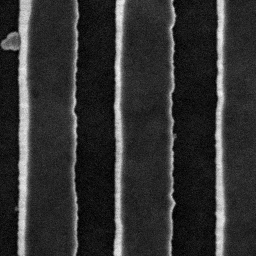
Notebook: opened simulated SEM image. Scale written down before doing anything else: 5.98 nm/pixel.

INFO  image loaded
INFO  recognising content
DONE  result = lines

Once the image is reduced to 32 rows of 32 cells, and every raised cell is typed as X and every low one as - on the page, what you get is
---XXXXXXX-----XXXXXXX------XXXX
---XXXXXXX-----XXXXXXX------XXXX
---XXXXXXX-----XXXXXXX------XXXX
---XXXXXXX-----XXXXXXX-----XXXXX
---XXXXXXX-----XXXXXX------XXXXX
---XXXXXXX-----XXXXXXX-----XXXXX
---XXXXXXX-----XXXXXXX-----XXXXX
---XXXXXXX-----XXXXXXX-----XXXXX
---XXXXXXX-----XXXXXXX-----XXXXX
---XXXXXX------XXXXXXX-----XXXXX
---XXXXXX------XXXXXXX-----XXXXX
---XXXXXX------XXXXXXX-----XXXXX
---XXXXXX------XXXXXX------XXXXX
---XXXXXX------XXXXXX------XXXXX
---XXXXXX------XXXXXX------XXXXX
---XXXXXXX-----XXXXXXX-----XXXXX
---XXXXXX------XXXXXX------XXXXX
---XXXXXXX-----XXXXXXX-----XXXXX
---XXXXXX------XXXXXXX-----XXXXX
---XXXXXX------XXXXXXX-----XXXXX
---XXXXXX------XXXXXXX-----XXXXX
---XXXXXX------XXXXXXX-----XXXXX
---XXXXXX------XXXXXXX-----XXXXX
---XXXXXX------XXXXXXX-----XXXXX
---XXXXXXX-----XXXXXXX-----XXXXX
---XXXXXXX-----XXXXXXX-----XXXXX
---XXXXXXX-----XXXXXXX-----XXXXX
---XXXXXXX-----XXXXXX------XXXXX
---XXXXXXX-----XXXXXX------XXXXX
---XXXXXXX-----XXXXXX------XXXXX
---XXXXXXX-----XXXXXX------XXXXX
---XXXXXXX-----XXXXXX------XXXXX